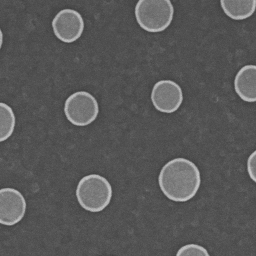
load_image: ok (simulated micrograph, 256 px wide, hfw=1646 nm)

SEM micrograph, raised bodies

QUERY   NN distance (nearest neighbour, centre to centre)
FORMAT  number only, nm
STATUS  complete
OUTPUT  543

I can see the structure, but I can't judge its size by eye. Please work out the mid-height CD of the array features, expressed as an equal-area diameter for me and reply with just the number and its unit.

203 nanometers